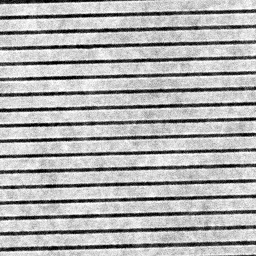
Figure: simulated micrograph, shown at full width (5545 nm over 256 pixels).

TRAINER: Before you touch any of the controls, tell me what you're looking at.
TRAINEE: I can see parallel lines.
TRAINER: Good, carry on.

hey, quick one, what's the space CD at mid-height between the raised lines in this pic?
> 0.106 µm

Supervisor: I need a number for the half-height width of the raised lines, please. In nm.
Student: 233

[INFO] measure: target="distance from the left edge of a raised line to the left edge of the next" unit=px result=15.4